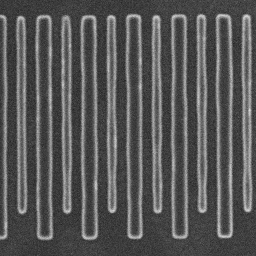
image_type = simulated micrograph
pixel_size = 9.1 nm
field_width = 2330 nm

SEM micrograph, groups of lines, slits or small figures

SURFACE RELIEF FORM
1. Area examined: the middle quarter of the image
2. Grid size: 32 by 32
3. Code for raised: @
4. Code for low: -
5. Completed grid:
@@---@@@---@@---@@@---@@---@@@--
@@---@@@---@@---@@@---@@---@@@--
@@---@@@---@@---@@@---@@---@@@--
@@---@@@---@@---@@@---@@---@@@--
@@---@@@---@@---@@@---@@---@@@--
@@---@@@---@@---@@@---@@---@@@--
@@---@@@---@@---@@@---@@---@@@--
@@---@@@---@@---@@@---@@---@@@--
@@---@@@---@@---@@@---@@---@@@@-
@@---@@@---@@---@@@---@@---@@@@-
@@---@@@---@@---@@@---@@---@@@@-
@@---@@@---@@---@@@---@@---@@@@-
@@---@@@---@@---@@@---@@---@@@@-
@@---@@@---@@---@@@---@@---@@@@-
@@---@@@---@@---@@@---@@---@@@@-
@@---@@@---@@---@@@---@@---@@@@-
@@---@@@---@@---@@@---@@---@@@@-
@@---@@@---@@---@@@---@@---@@@@-
@@---@@@---@@---@@@---@@---@@@@-
@@---@@@---@@---@@@---@@---@@@@-
@@---@@@---@@---@@@---@@---@@@@-
@@---@@@---@@---@@@---@@---@@@@-
@@---@@@---@@---@@@---@@---@@@@-
@@---@@@---@@---@@@---@@---@@@@-
@@---@@@---@@---@@@---@@---@@@@-
@@---@@@---@@---@@@---@@---@@@@-
@@---@@@---@@---@@@---@@---@@@@-
@@---@@@---@@---@@@---@@---@@@@-
@@---@@@---@@---@@@---@@---@@@@-
@@---@@@---@@---@@@---@@---@@@@-
@@---@@@---@@---@@@---@@---@@@@-
@@---@@@---@@---@@@---@@---@@@@-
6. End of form